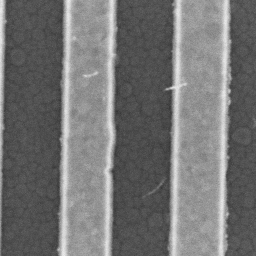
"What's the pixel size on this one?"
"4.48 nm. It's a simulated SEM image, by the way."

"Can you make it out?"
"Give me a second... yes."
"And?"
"one or a few lines or trenches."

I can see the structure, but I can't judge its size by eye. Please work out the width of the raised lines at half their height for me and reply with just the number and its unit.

208 nanometers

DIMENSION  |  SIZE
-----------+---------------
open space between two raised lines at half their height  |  0.3 µm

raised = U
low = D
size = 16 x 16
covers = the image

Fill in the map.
DDDDUUUDDDDUUUDD
DDDDUUUDDDDUUUDD
DDDDUUUDDDDUUUDD
DDDDUUUDDDDUUUDD
DDDDUUUDDDDUUUDD
DDDDUUUDDDDUUUDD
DDDDUUUDDDDUUUDD
DDDDUUUDDDDUUUDD
DDDDUUUDDDDUUUDD
DDDDUUUDDDDUUUDD
DDDDUUUDDDDUUUDD
DDDDUUUDDDDUUUDD
DDDDUUUDDDDUUUDD
DDDDUUUDDDDUUUDD
DDDDUUUDDDDUUUDD
DDDDUUUDDDDUUUDD